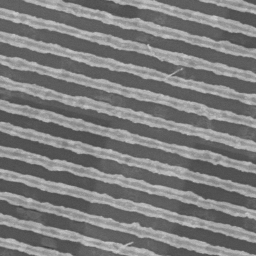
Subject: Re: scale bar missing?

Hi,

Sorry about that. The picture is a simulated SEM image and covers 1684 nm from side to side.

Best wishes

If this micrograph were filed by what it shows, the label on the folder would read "parallel lines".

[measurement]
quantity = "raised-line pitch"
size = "146 nanometres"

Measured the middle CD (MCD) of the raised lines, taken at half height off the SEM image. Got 50.2 nm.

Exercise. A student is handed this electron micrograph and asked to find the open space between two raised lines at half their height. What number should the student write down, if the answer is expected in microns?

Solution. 0.0948